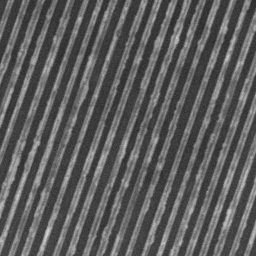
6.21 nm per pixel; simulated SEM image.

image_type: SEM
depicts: parallel lines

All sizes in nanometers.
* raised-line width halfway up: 35.9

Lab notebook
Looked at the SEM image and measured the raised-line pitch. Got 13.9 pixels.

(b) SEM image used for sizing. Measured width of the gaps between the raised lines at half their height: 49.2 nanometers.